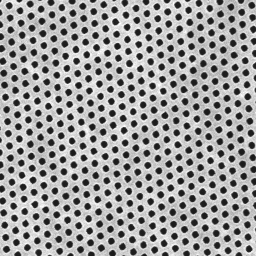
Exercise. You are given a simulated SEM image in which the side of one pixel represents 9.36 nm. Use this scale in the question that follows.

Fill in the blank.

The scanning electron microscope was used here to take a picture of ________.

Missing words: a regular array of holes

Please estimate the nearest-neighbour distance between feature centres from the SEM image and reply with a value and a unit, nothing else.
111 nm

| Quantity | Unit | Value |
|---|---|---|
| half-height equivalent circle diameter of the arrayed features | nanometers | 68.4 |